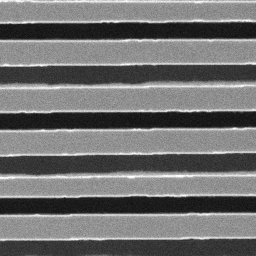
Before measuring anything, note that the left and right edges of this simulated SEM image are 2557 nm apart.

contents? lines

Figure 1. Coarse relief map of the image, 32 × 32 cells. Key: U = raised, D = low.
UUUUUUUUUUUUUUUUUUUUUUUUUUUUUUUU
UUUUUUUUUUUUUUUUUUUUUUUUUUUUUUUU
UUUUUUUUUUUUUUUUUUUUUUUUUUUUUUUU
DDDDDDDDDDDDDDDDDDDDDDDDDDDDDDDD
DDDDDDDDDDDDDDDDDDDDDDDDDDDDDDDD
UUUUUUUUUUUUUUUUUUUUUUUUUUUUUUUU
UUUUUUUUUUUUUUUUUUUUUUUUUUUUUUUU
UUUUUUUUUUUUUUUUUUUUUUUUUUUUUUUU
DDDDDDDDDDDDDDDDDDDDDDDDDDDDDDDD
DDDDDDDDDDDDDDDDDDDDDDDDDDDDDDDD
DDDDDDDDDDDDDDDDDDDDDDDDDDDDDDDD
UUUUUUUUUUUUUUUUUUUUUUUUUUUUUUUU
UUUUUUUUUUUUUUUUUUUUUUUUUUUUUUUU
UUUUUUUUUUUUUUUUUUUUUUUUUUUUUUUU
DDDDDDDDDDDDDDDDDDDDDDDDDDDDDDDD
DDDDDDDDDDDDDDDDDDDDDDDDDDDDDDDD
UUUUUUUUUUUUUUUUUUUUUUUUUUUUUUUU
UUUUUUUUUUUUUUUUUUUUUUUUUUUUUUUU
UUUUUUUUUUUUUUUUUUUUUUUUUUUUUUUU
DDDDDDDDDDDDDDDDDDDDDDDDDDDDDDDD
DDDDDDDDDDDDDDDDDDDDDDDDDDDDDDDD
DDDDDDDDDDDDDDDDDDDDDDDDDDDDDDDD
UUUUUUUUUUUUUUUUUUUUUUUUUUUUUUUU
UUUUUUUUUUUUUUUUUUUUUUUUUUUUUUUU
UUUUUUUUUUUUUUUUUDUUUUUUUDDDDDDD
DDDDDDDDDDDDDDDDDDDDDDDDDDDDDDDD
DDDDDDDDDDDDDDDDDDDDDDDDDDDDDDDD
UUUUUUUUUUUUUUUUUUUUUUUUUUUUUUUU
UUUUUUUUUUUUUUUUUUUUUUUUUUUUUUUU
UUUUUUUUUUUUUUUUUUUUUUUUUUUUUUUU
DDDDDDDDDDDDDDDDDDDDDDDDDDDDDDDD
DDDDDDDDDDDDDDDDDDDDDDDDDDDDDDDD